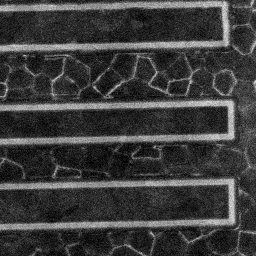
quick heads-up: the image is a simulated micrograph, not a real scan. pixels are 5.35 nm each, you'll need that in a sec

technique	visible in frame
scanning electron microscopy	one or a few lines or trenches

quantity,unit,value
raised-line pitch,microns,0.476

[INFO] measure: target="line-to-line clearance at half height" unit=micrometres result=0.245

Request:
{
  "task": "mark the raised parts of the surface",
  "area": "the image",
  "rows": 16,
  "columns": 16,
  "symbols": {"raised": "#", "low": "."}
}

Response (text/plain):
..############..
##############..
##############..
................
................
................
............##..
##############..
##############..
................
................
........######..
##############..
##############..
................
................